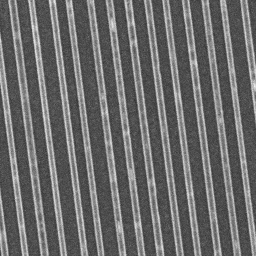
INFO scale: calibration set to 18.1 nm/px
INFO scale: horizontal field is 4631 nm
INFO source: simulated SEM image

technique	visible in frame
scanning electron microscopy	parallel lines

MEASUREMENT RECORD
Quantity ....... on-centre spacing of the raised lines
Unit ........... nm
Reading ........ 345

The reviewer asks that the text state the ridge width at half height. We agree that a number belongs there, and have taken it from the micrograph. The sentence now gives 112 nm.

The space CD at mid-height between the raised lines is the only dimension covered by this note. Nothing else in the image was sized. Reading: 227 nanometres